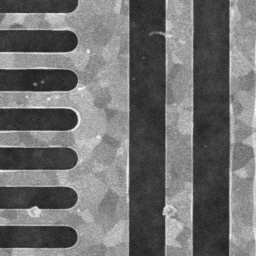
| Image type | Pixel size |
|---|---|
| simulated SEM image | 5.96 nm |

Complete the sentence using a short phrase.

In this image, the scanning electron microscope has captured groups of lines, slits or small figures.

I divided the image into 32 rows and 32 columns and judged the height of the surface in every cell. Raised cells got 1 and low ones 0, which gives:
00000000001111110000011100000111
00000000011111110000011100000111
11111111111111110000011100000111
11111111111111110000011100000111
00000000001111110000011100000111
00000000001111110000011100000111
00000000011111110000011100000111
11111111111111110000011100000111
11111011111111110000011100000111
00000000001111110000011100000111
00000000001111110000011100000111
00000000111111110000011100000111
11111111111111110000011100000111
00000000111111110000011100000111
00000000001111110000011100000111
00000000001111110000011100000111
01111111111111110000011100000111
11111111111111110000011100000111
00000000011111110000011100000111
00000000001111110000011100000111
00000000001111110000011100000111
11111111111111110000011100000111
11111111111111110000011100000111
00000000011111110000011100000111
00000000001111110000011100000111
00000000011111110000011100000111
11111111111111110000111100000111
11111111111111110000011100000111
00000000011111110000011100000111
00000000001111110000011100000111
00000000011111110000011100000111
11111111111111110000011100000111